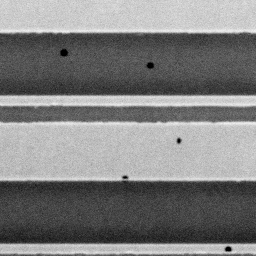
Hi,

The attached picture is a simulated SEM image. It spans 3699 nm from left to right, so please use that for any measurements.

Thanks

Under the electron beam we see lines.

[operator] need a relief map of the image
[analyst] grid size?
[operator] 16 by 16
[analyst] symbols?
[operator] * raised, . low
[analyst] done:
****************
****************
................
................
................
................
****************
****************
****************
****************
****************
................
................
................
................
****************